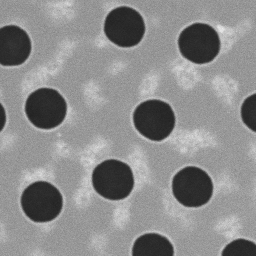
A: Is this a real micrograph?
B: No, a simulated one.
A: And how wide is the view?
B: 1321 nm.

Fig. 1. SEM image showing holes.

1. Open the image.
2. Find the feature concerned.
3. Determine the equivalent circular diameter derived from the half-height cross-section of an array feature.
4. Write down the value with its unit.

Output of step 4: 41.7 px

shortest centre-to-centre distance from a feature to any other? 394 nm